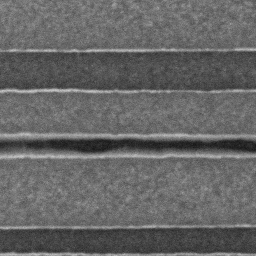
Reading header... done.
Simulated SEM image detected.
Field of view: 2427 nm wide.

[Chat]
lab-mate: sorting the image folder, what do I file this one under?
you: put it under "lines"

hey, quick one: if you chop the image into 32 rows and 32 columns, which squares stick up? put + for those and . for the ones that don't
++++++++++++++++++++++++++++++++
++++++++++++++++++++++++++++++++
++++++++++++++++++++++++++++++++
++++++++++++++++++++++++++++++++
++++++++++++++++++++++++++++++++
++++++++++++++++++++++++++++++++
................................
................................
................................
................................
................................
+++++++++++++++..++++++++..+++++
++++++++++++++++++++++++++++++++
++++++++++++++++++++++++++++++++
++++++++++++++++++++++++++++++++
++++++++++++++++++++++++++++++++
++++++++++++++++++++++++++++++++
................................
................................
++++++++++...+++++++++++++++++++
++++++++++++++++++++++++++++++++
++++++++++++++++++++++++++++++++
++++++++++++++++++++++++++++++++
++++++++++++++++++++++++++++++++
++++++++++++++++++++++++++++++++
++++++++++++++++++++++++++++++++
++++++++++++++++++++++++++++++++
++++++++++++++++++++++++++++++++
++..............................
................................
................................
................................